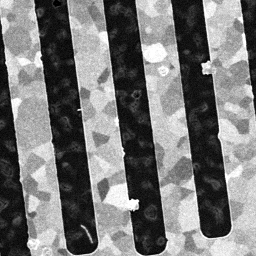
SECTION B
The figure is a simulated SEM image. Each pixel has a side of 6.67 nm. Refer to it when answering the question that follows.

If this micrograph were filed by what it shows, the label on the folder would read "one or a few lines or trenches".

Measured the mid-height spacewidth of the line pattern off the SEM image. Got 0.218 µm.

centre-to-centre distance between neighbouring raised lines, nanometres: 451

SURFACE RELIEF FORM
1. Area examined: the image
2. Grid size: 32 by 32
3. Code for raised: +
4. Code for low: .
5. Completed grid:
++++.....++++....++++....+++++..
+++++....++++....+++++....++++..
+++++....++++....+++++....++++..
+++++....++++....+++++....++++..
+++++....++++.....++++....+++++.
.++++....+++++....++++....+++++.
.++++....+++++....++++....+++++.
.++++....+++++....++++....+++++.
.++++.....++++....++++...++++++.
.++++.....++++....+++++...+++++.
.+++++....++++....+++++....++++.
.+++++....++++....+++++....++++.
.+++++....++++.....++++....+++++
..++++....+++++....++++....+++++
..++++....+++++....++++....+++++
..++++....+++++....++++....+++++
..++++.....++++....++++....+++++
..++++.....++++....+++++...+++++
..+++++....++++....+++++....++++
..+++++....++++.....++++....++++
...++++....+++++....++++....++++
...++++....+++++....++++....++++
...++++....+++++....++++....++++
...++++....+++++....++++....++++
...++++.....++++....+++++....+++
...+++++....+++++...+++++....+++
...+++++....++++....+++++....+++
...+++++....++++.....++++....+++
....++++....++++.....++++....+++
....++++....+++++....+++++..++++
...+++++....+++++....+++++++++++
....+++++...+++++...++++++++++++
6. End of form